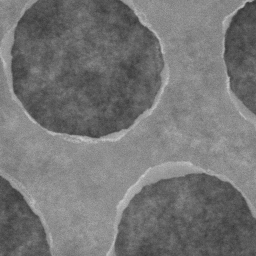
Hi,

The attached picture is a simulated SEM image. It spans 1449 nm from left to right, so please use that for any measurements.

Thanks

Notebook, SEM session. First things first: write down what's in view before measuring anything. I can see holes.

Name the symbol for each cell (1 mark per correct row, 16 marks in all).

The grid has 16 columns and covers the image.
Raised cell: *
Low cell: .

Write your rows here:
**......*******.
*........*****..
*.........****..
*.........****..
*.........****..
*.........****..
*.........*****.
**.......*******
*****..*********
****************
****************
.********.....**
..******.......*
..******........
...****.........
...****.........